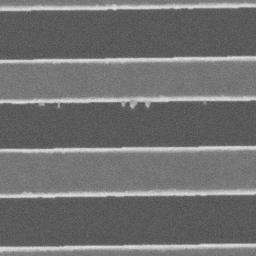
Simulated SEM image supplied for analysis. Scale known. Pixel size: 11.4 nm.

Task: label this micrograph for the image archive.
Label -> lines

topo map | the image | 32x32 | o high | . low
oooooooooooooooooooooooooooooooo
................................
................................
................................
................................
................................
................................
..............oooooooooooooooooo
oooooooooooooooooooooooooooooooo
oooooooooooooooooooooooooooooooo
oooooooooooooooooooooooooooooooo
oooooooooooooooooooooooooooooooo
ooooooooooooooooo.o.............
................................
................................
................................
................................
................................
..........................oooooo
oooooooooooooooooooooooooooooooo
oooooooooooooooooooooooooooooooo
oooooooooooooooooooooooooooooooo
oooooooooooooooooooooooooooooooo
oooooooooooooooooooooooooooooooo
ooooooo.........................
................................
................................
................................
................................
................................
................................
oooooooooooooooooooooooooooooooo